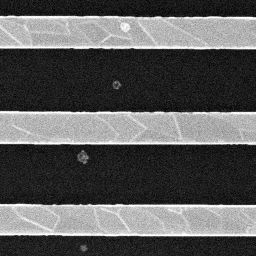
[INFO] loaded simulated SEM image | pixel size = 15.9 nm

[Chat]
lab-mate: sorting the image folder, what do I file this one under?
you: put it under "lines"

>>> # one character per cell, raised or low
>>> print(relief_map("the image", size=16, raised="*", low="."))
................
****************
****************
................
................
................
................
****************
****************
................
................
................
................
****************
****************
................